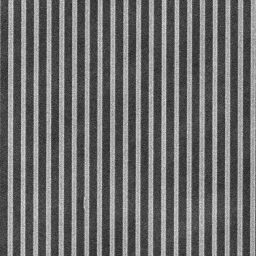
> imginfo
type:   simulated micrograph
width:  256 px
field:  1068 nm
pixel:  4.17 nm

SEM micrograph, parallel lines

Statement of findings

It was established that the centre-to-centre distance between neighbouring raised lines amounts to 53.2 nm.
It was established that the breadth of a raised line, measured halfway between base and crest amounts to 15.6 nanometres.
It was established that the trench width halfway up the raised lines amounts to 34.9 nanometers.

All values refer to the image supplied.